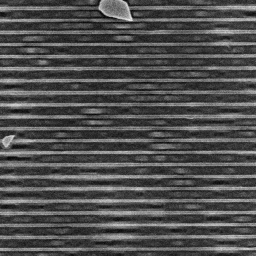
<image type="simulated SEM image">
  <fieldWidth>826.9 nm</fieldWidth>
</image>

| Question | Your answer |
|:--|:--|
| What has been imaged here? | parallel lines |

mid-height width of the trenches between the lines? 0.0299 um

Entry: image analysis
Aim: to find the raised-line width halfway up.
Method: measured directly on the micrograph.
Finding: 0.0085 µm